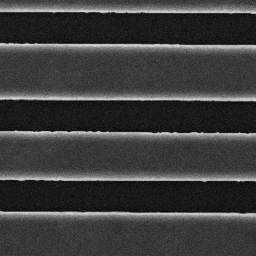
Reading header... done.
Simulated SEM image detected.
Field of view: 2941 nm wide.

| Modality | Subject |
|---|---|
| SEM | lines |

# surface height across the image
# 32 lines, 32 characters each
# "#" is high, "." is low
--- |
################################
..............###.##############
................................
................................
................................
................................
################################
################################
################################
################################
################################
################################
...............................#
................................
................................
................................
##############..................
################################
################################
################################
################################
################################
.......#####.###################
................................
................................
................................
................................
################################
################################
################################
################################
################################